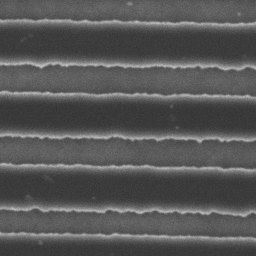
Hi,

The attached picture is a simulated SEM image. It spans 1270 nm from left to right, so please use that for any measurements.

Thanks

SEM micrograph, lines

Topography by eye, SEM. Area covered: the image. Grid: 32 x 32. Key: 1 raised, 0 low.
00000000000000000000000000000000
00000000000000000000000000000000
00000000000000000000000000000000
11111111111111111111111111111111
11111111111111111111111111111111
11111111111111111111111111111111
11111111111111111111111111111111
11111111111111111111111111111111
00000000000000000000000000001100
00000000000000000000000000000000
00000000000000000000000000000000
10000000000000000000000000000000
11111111111111111111111111111111
11111111111111111111111111111111
11111111111111111111111111111111
11111111111111111111111111111111
11111111111111111111111111111111
00000000000000000000000011011111
00000000000000000000000000000000
00000000000000000000000000000000
10000000000000000000000000000000
11111111111111111111111111111111
11111111111111111111111111111111
11111111111111111111111111111111
11111111111111111111111111111111
11111111111111111111111111111111
00000000000010010100101111111111
00000000000000000000000000000000
00000000000000000000000000000000
11111111111111111111100100000000
11111111111111111111111111111111
11111111111111111111111111111111